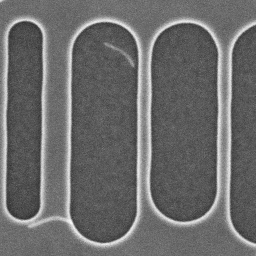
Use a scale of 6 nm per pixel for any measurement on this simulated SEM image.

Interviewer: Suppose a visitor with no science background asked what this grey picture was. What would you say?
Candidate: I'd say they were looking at groups of lines, slits or small figures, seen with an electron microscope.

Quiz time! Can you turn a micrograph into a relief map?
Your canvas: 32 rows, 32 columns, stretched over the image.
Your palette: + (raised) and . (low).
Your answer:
++++++++++++++++++++++++++++++++
++++++++++++++++++++++++++++++++
++++++++++++++++++++++++++++++++
+....++++++.....+++++.....+++++.
+....+++++.......+++......++++..
+....++++........++........++...
+....++++........++........++...
+....++++........++........++...
+....++++........++........++...
+....++++........++........++...
+....++++........++........++...
+....++++........++........++...
+....++++........++........++...
+....++++........++........++...
+....++++........++........++...
+....++++........++........++...
+....++++........++........++...
+....++++........++........++...
+....++++........++........++...
+....++++........++........++...
+....++++........++........++...
+....++++........++........++...
+....++++........++........++...
+....++++........++........++...
+....++++........++........++...
+....++++........++........++...
+....++++........+++......+++...
+++++++++........+++++..+++++...
+++++++++.......+++++++++++++...
++++++++++.....+++++++++++++++..
++++++++++++++++++++++++++++++++
++++++++++++++++++++++++++++++++